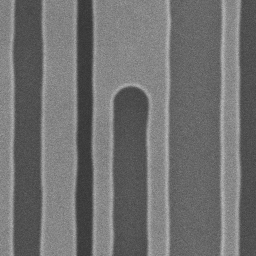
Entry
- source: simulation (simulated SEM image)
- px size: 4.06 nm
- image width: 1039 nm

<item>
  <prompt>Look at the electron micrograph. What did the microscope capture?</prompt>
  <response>groups of lines, slits or small figures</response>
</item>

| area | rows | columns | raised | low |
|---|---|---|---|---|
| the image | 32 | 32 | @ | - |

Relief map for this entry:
@@---@@@@@--@@@@@@@@@-------@@--
@@---@@@@@--@@@@@@@@@-------@@--
@@---@@@@@--@@@@@@@@@-------@@--
@@---@@@@@--@@@@@@@@@-------@@--
@@---@@@@@--@@@@@@@@@-------@@--
@@---@@@@@--@@@@@@@@@-------@@--
@@---@@@@@--@@@@@@@@@-------@@--
@@---@@@@@--@@@@@@@@@-------@@--
@@---@@@@@--@@@@@@@@@-------@@--
@@---@@@@@--@@@@@@@@@-------@@--
@@---@@@@@--@@@@@@@@@-------@@--
@@---@@@@@--@@@---@@@-------@@--
@@---@@@@@--@@-----@@-------@@--
@@---@@@@@--@@-----@@-------@@--
@@---@@@@@--@@-----@@-------@@--
@@---@@@@@--@@----@@@-------@@--
@@---@@@@@--@@----@@@-------@@--
@@---@@@@---@@----@@@-------@@--
@@---@@@@@--@@----@@@-------@@--
@@---@@@@@--@@-----@@-------@@--
@@---@@@@@--@@-----@@-------@@--
@@---@@@@@--@@-----@@-------@@--
@@---@@@@---@@-----@@-------@@--
@@---@@@@---@@-----@@-------@@--
@@---@@@@---@@-----@@-------@@--
@@---@@@@---@@-----@@-------@@--
@@---@@@@---@@-----@@-------@@--
@@---@@@@---@@-----@@-------@@--
@@---@@@@---@@-----@@-------@@--
@@---@@@@---@@-----@@-------@@--
@@---@@@@---@@-----@@-------@@--
@@---@@@@---@@-----@@-------@@--